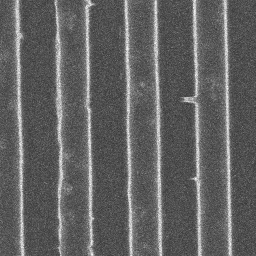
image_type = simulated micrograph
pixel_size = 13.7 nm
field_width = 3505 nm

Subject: one or a few lines or trenches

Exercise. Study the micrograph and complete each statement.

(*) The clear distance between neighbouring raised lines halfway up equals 535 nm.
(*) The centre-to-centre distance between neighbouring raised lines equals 945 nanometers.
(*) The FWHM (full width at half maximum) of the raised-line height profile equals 419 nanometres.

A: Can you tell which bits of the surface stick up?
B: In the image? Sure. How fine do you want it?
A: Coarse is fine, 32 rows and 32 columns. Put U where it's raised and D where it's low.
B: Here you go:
UUDDDDDUUUUDDDDDUUUDDDDDUUUUDDDD
UUDDDDDUUUUDDDDDUUUDDDDDUUUUDDDD
UUDDDDDUUUUDDDDDUUUDDDDDUUUUDDDD
UUDDDDDUUUUDDDDDUUUDDDDDUUUUDDDD
UUDDDDDUUUUDDDDDUUUDDDDDUUUUDDDD
UUDDDDDUUUUDDDDDUUUUDDDDDUUUDDDD
UUDDDDDUUUUDDDDDUUUUDDDDDUUUDDDD
UUDDDDDUUUUDDDDDUUUUDDDDDUUUDDDD
UUDDDDDUUUUDDDDDUUUUDDDDDUUUDDDD
UUDDDDDUUUUDDDDDUUUUDDDDDUUUDDDD
UUDDDDDUUUUDDDDDUUUUDDDDDUUUDDDD
UUDDDDDUUUUDDDDDUUUUDDDDDUUUDDDD
UUDDDDDUUUUDDDDDUUUUDDDDUUUUDDDD
UUDDDDDUUUUDDDDDUUUUDDDDDUUUDDDD
UUDDDDDUUUUDDDDDUUUUDDDDDUUUDDDD
UUDDDDDUUUUDDDDDUUUUDDDDDUUUDDDD
UUUDDDDUUUUDDDDDUUUUDDDDDUUUDDDD
UUUDDDDDUUUDDDDDUUUUDDDDDUUUDDDD
UUUDDDDDUUUDDDDDUUUUDDDDDUUUDDDD
UUUDDDDDUUUDDDDDUUUUDDDDDUUUUDDD
UUUDDDDDUUUDDDDDUUUUDDDDDUUUUDDD
UUUDDDDDUUUDDDDDUUUUDDDDDUUUUDDD
UUUDDDDDUUUDDDDDUUUUDDDDDUUUUDDD
UUUDDDDUUUUDDDDDUUUUDDDDDUUUUDDD
UUUDDDDUUUUDDDDDUUUUDDDDDUUUUDDD
UUUDDDDUUUUDDDDDUUUUDDDDDUUUUDDD
UUUDDDDUUUUDDDDDUUUUDDDDDUUUUDDD
UUUDDDDDUUUDDDDDUUUUDDDDDUUUUDDD
UUUDDDDDUUUDDDDDUUUUDDDDDUUUUDDD
UUUDDDDDUUUDDDDDUUUUDDDDDUUUUDDD
UUUDDDDUUUUDDDDDUUUUDDDDDUUUUDDD
UUUDDDDUUUUDDDDDUUUUDDDDDUUUUDDD